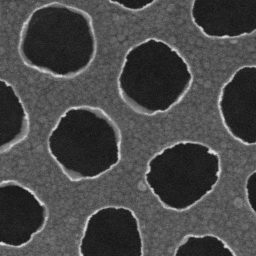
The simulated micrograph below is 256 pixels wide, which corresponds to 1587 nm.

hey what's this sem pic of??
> holes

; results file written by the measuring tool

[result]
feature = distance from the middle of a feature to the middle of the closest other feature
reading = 99.3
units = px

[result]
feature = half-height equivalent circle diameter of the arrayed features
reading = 419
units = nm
